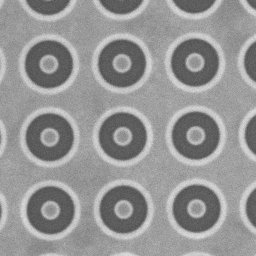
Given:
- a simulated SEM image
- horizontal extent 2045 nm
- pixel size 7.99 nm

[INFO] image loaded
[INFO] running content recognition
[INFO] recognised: an array of small figures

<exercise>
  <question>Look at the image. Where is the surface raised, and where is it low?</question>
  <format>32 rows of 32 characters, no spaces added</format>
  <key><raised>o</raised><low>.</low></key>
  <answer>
ooo......ooo......ooo......oooo.
oooo....ooooo....ooooo....oooooo
oooooooooooooooooooooooooooooooo
oooooooooooooooooooooooooooooooo
oooooooooooooooooooooooo.ooooooo
oooo....ooooo.....oooo.....oooo.
ooo......ooo......ooo......ooo..
ooo..oo..ooo...o...oo...o...oo..
ooo..oo..ooo...o...oo...o...oo..
ooo......ooo......ooo......oooo.
oooo....ooooo....ooooo....oooooo
oooooooooooooooooooooooooooooooo
oooooooooooooooooooooooooooooooo
oooooooooooooooooooooooooooooooo
oooo....ooooo....ooooo.....oooo.
ooo......ooo......oooo......ooo.
ooo...o..ooo...o...oo...o...oo..
ooo..oo..ooo...o...oo...o...oo..
ooo......ooo......oooo.....oooo.
oooo.....oooo.....oooo.....ooooo
oooooooooooooooooooooooooooooooo
oooooooooooooooooooooooooooooooo
oooooooooooooooooooooooooooooooo
ooooo...oooooo...ooooo.....ooooo
ooo......oooo.....oooo.....oooo.
ooo...o...oo...o...oo...o...oo..
.oo...o...oo...o...oo...o...oo..
ooo......ooo......oooo......ooo.
oooo.....oooo.....oooo.....ooooo
oooooo.oooooooo.oooooooooooooooo
oooooooooooooooooooooooooooooooo
oooooooooooooooooooooooooooooooo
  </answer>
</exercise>